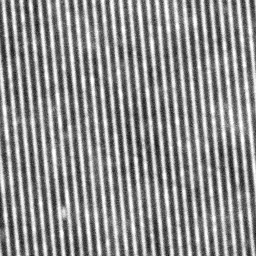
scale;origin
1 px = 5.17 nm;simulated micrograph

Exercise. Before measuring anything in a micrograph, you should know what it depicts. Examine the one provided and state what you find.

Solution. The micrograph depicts parallel lines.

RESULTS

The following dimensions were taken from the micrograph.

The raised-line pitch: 8.99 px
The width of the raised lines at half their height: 9.6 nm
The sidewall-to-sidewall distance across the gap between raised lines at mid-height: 35.4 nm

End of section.